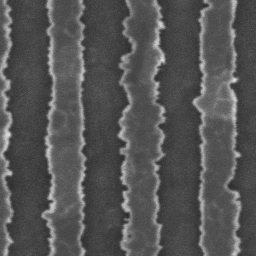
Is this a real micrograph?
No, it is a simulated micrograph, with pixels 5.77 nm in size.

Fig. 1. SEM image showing one or a few lines or trenches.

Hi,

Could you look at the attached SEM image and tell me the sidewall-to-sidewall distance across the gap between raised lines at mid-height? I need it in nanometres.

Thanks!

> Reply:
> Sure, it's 244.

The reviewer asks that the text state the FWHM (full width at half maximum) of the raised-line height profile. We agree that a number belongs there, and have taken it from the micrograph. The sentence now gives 0.193 micrometres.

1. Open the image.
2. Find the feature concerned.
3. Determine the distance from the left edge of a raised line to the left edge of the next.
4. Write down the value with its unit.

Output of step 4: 0.438 µm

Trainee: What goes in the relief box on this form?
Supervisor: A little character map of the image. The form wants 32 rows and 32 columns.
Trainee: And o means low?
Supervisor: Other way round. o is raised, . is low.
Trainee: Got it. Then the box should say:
o.....oooo......oooo......ooo...
o.....oooo......oooo.....oooo...
o.....oooo......oooo.....oooo...
o.....oooo......oooo.....oooo...
o.....oooo......oooo.....oooo...
o.....oooo.......ooo.....oooo...
o.....oooo......oooo.....oooo...
o.....oooo.....ooooo.....oooo...
......oooo.....ooooo.....oooo...
.......ooo.....oooo......oooo...
o......ooo.....ooooo.....oooo...
o......ooo......oooo.....oooo...
o......ooo......oooo....ooooo...
o.....oooo......oooo.....oooo...
o.....oooo.....ooooo.....oooo...
o.....oooo.....ooooo.....oooo...
o.....oooo.....ooooo.....oooo...
o.....oooo......oooo.....oooo...
o.....oooo.....ooooo.....oooo...
......oooo.....ooooo.....ooooo..
o.....oooo.....oooo......oooo...
o.....oooo.....ooooo.....oooo...
o......ooo.....ooooo.....oooo...
o......ooo......oooo.....ooo....
o.....oooo......oooo.....ooooo..
o......ooo.....ooooo.....ooooo..
oo....oooo......oooo.....ooooo..
o.....oooo......oooo.....ooooo..
o.....oooo......oooo.....ooooo..
o......ooo.....ooooo.....ooooo..
o.....oooo.....ooooo.....ooooo..
o.....ooooo.....oooo......oooo..